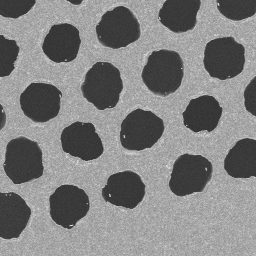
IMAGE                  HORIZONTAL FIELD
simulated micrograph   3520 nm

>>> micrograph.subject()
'a regular array of holes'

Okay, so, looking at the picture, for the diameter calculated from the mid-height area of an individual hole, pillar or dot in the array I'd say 576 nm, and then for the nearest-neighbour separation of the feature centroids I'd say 797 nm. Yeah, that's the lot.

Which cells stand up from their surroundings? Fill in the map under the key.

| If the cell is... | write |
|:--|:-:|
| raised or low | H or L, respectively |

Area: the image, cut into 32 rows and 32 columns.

LLLLHHHHHLHHHHHHHHHHLLLLLHHLLLLL
LLLHHHHHHHHHHLLLHHHHLLLLLHHHLLLL
HHHHHHHHHHHHHLLLLHHHLLLLLHHHHLHH
HHHHHHLLLLHHLLLLLHHHHLLLHHHHHHHH
HHHHHHLLLLHHLLLLLHHHHHHHHHHHHHHH
LLHHHLLLLLHHHLLLHHHHHHHHHHLLLLHH
LLHHHLLLLLHHHHHHHHHLLLHHHHLLLLLH
LLHHHHLLLHHHHHHHHHLLLLLHHLLLLLLH
LLHHHHHHHHHLLLLHHHLLLLLHHHLLLLHH
LHHHHHHHHHHLLLLHHHLLLLLHHHLLLHHH
HHHHLLHHHHLLLLLHHHLLLLLHHHHHHHHL
HHHLLLLLHHLLLLLHHHHLLLHHHHHHHHHL
HHLLLLLLHHHLLLLHHHHHHHHHLLLHHHHL
HHHLLLLHHHHHLLHHHHHHHHHLLLLLHHHL
LHHLLLLHHHHHHHHHLLLLHHHLLLLLHHHH
LHHHHHHHHLLHHHHLLLLLHHHLLLLHHHHH
HHHHHHHHLLLLHHHLLLLLHHHHHHHHHHHH
HLLLHHHHLLLLLHHLLLLLHHHHHHHHHHLL
HLLLLHHHLLLLLHHHLLLHHHHHHHHHHLLL
HLLLLHHHHLLLHHHHHHHHHHHLLHHHLLLL
HLLLLHHHHHHHHHHHHHHHHHLLLLHHLLLL
HLLLLHHHHHHHHHHLHHHHHLLLLLHHLLLL
HLLLHHHHHHHHHLLLLLHHHLLLLLHHHHHH
HHHHHHHLLLHHHLLLLLHHHLLLLHHHHHHH
LLHHHHLLLLLHHLLLLLHHHHLHHHHHHHHH
LLLHHHLLLLLHHHLLLHHHHHHHHHHHHHHH
LLLLHHLLLLLHHHHHHHHHHHHHHHHHHHHH
LLLLHHHLLLHHHHHHHHHHHHHHHHHHHHHH
LLLHHHHHLHHHHHHHHHHHHHHHHHHHHHHH
LLHHHHHHHHHHHHHHHHHHHHHHHHHHHHHH
HHHHHHHHHHHHHHHHHHHHHHHHHHHHHHHH
HHHHHHHHHHHHHHHHHHHHHHHHHHHHHHHH